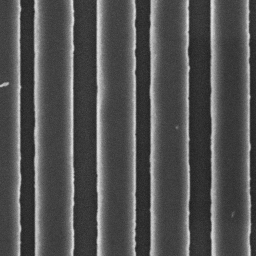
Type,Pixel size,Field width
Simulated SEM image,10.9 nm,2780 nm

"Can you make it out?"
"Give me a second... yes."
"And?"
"lines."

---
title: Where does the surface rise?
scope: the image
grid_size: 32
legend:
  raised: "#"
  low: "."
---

###.#####...#####..#####...####.
###.#####...#####..#####...####.
##..#####...#####..#####...####.
##..#####...#####..#####...####.
##..#####...#####..#####...####.
##..#####...#####..#####...####.
##..#####...#####..####....####.
##..#####...#####..#####...####.
##..#####...#####..#####...####.
##..#####...#####..#####...####.
##..#####...#####..#####...####.
##..#####...#####..#####...####.
##..#####...#####..#####...####.
##..#####...#####..#####...####.
##..#####...#####..#####...####.
##..#####...#####..#####...####.
##..#####...#####..#####...####.
##..#####...#####..#####...####.
##..#####...#####..#####...####.
###.#####...#####..#####...####.
##..#####...#####..#####...####.
###.#####...#####..#####...####.
###.#####...#####..#####...####.
##..#####...#####..#####...####.
##...####...#####..#####...####.
##...####...#####..#####...####.
##..#####...#####..#####...####.
##..#####...#####..#####...####.
###..####...#####..#####...####.
##...####...#####..#####...####.
##...####...#####..#####...####.
##..#####...#####..#####...####.